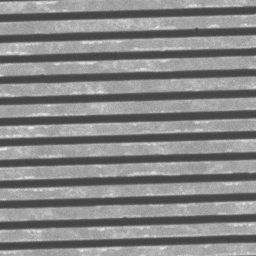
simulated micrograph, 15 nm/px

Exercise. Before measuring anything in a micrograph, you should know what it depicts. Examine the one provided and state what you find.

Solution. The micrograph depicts parallel lines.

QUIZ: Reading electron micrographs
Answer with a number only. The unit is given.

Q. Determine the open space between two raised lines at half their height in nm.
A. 109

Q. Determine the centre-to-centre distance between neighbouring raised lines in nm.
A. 311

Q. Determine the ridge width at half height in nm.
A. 201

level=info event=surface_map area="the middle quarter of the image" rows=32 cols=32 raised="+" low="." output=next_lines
++++++++++++++++++++++++++++++++
++++++++++++++++++++++++++++++++
................................
................................
........++++++++++++++++++++++++
++++++++++++++++++++++++++++++++
++++++++++++++++++++++++++++++++
+++++.++++++....................
................................
.............+++++++++++++++++++
++++++++++++++++++++++++++++++++
++++++++++++++++++++++++++++++++
+++++++++++++++++...............
................................
..................+++++..+++++++
++++++++++++++++++++++++++++++++
++++++++++++++++++++++++++++++++
++++++++++++++++++++++..........
................................
.......................+++++++++
++++++++++++++++++++++++++++++++
++++++++++++++++++++++++++++++++
+++++++++++++++++++++++++++.....
................................
...........................+++++
++++++++++++++++++++++++++++++++
++++++++++++++++++++++++++++++++
++++++++++++++++++++++++++++++++
................................
................................
.......+++++++++++++++++++++++++
++++++++++++++++++++++++++++++++